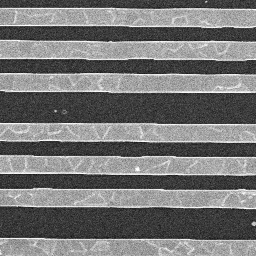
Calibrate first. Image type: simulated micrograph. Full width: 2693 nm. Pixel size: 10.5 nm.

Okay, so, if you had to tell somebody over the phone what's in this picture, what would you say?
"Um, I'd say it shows wiring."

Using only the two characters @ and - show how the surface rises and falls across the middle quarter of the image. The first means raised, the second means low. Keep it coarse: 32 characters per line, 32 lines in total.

--------------------------------
--------------------------------
--------------------------------
@@@@@@@@@@@@@@@@@@@@@@@@@@@@@@@@
@@@@@@@@@@@@@@@@@@@@@@@@@@@@@@@@
@@@@@@@@@@@@@@@@@@@@@@@@@@@@@@@@
@@@@@@@@@@@@@@@@@@@@@@@@@@@@@@@@
--------------------------------
--------------------------------
--------------------------------
--------------------------------
--------------------------------
--------------------------------
--------------------------------
--------------------------------
@@@@@@@@@@@@@@@@@@@@@@@@@@@@@@@@
@@@@@@@@@@@@@@@@@@@@@@@@@@@@@@@@
@@@@@@@@@@@@@@@@@@@@@@@@@@@@@@@@
@@@@@@@@@@@@@@@@@@@@@@@@@@@@@@@@
--------------------------------
--------------------------------
--------------------------------
--------------------------------
@@@@@@@@@@@@@@@@@@@@@@@@@@@@@@@@
@@@@@@@@@@@@@@@@@@@@@@@@@@@@@@@@
@@@@@@@@@@@@@@@@@@@@@@@@@@@@@@@@
@@@@@@@@@@@@@@@@@@@@@@@@@@@@@@@@
---------------------@@@@@--@@@@
--------------------------------
--------------------------------
--------------------------------
@@@@@@@@@@@@@@@@@@@@@@@@@-------